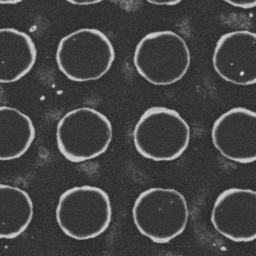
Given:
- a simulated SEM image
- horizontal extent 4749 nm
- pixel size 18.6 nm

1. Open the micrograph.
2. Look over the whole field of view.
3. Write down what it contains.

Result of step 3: raised bodies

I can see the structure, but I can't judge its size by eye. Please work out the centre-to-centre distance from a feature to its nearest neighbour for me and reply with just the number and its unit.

1430 nm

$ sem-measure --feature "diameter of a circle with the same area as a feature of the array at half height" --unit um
0.977